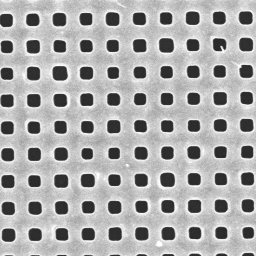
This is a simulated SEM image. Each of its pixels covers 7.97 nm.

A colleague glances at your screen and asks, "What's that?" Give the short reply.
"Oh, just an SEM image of a regular array of holes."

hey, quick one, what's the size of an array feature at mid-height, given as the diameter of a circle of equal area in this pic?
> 0.109 microns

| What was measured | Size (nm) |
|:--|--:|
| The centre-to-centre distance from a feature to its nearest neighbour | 211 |